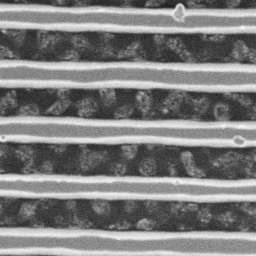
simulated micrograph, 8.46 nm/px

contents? parallel lines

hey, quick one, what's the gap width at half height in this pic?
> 35.9 px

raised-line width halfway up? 175 nm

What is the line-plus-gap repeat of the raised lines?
476 nanometers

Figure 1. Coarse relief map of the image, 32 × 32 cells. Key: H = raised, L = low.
LLLLLLLLLLLLLLLLLLLLLLLLLLLLLLLL
HHHHHHHHHHHHHHHHHHHHHHHHHHHLLLLL
HHHHHHHHHHHHHHHHHHHHHHHHHHHHHHHH
LLLLLHHLLLHHHHHHHHHHHHHHHHHHHHHH
LLLLLLLLLLLLLLLLLLLLLLLLLLLLLLLL
LLLLLLLLLLLLLLLLLLLLLLLLLLLLLLLL
LLLLLLLLLLLLLLLLLLLLLLLLLLLLLLLL
LLLLLLLLLLLLLLLLLLLLLLLLLLLLLLLL
HHHHHHHHHHHHHHHHHHHHHHHHHHHHHHHH
HHHHHHHHHHHHHHHHHHHHHHHHHHHHHHHH
LHHHHHHHHHHHHHHHHHHHHHHHHHHHHHHH
LLLLLLLLLLLLLLLLLLLLLLLLLLLLLLLL
LLLLLLLLLLLLLLLLLLLLLLLLLLLLLLLL
LLLLLLLLLLLLLLLLLLLLLLLLLLLLLLLL
LLLLLLLLLLLLLLLLLLLLLLLLLLLLLLLL
HHHHHHHHHHHHHHHHHHHHHHHHLLLLLLLL
HHHHHHHHHHHHHHHHHHHHHHHHHHHHHHHH
HLLLHHHHHHHHHHHHHHLHHHHHHHHHHHHH
LLLLLLLLLLLLLLLLLLLLLLLLLLLLLLLL
LLLLLLLLLLLLLLLLLLLLLLLLLLLLLLLL
LLLLLLLLLLLLLLLLLLLLLLLLLLLLLLLL
LLLLLLLLLLLLLLLLLLLLLLLLLLLLLLLL
HHHHHHHHHHHHHHHHHHHHHHHLLLLLLLLL
HHHHHHHHHHHHHHHHHHHHHHHHHHHHHHHH
LLLLLLHLLLLHHHHHHHHHHHHHHHHHHHHH
LLLLLLLLLLLLLLLLLLLLLLLLLLLLLLLL
LLLLLLLLLLLLLLLLLLLLLLLLLLLLLLLL
LLLLLLLLLLLLLLLLLLLLLLLLLLLLLLLL
LLLLLLLLLLLLLLLLLLLLLLLLLLLLLLLL
HHHHHHHHHHHHHHHHHHHHHHHHHHHHHHHH
HHHHHHHHHHHHHHHHHHHHHHHHHHHHHHHH
HHHHHHHHHHHHHHHHHHHHHHHHHHHHHHHH